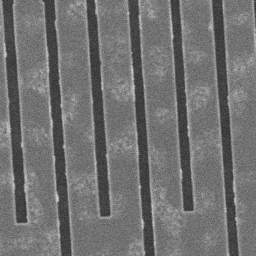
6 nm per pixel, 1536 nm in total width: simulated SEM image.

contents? parallel lines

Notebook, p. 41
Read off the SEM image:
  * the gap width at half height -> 59.1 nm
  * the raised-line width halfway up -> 192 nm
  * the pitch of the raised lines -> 0.251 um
